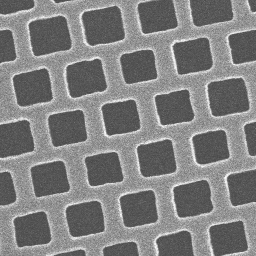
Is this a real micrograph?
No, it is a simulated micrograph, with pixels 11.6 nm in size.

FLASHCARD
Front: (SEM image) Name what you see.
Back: a regular array of holes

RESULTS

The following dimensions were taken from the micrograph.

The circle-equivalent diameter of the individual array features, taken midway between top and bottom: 444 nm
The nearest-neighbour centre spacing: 53.2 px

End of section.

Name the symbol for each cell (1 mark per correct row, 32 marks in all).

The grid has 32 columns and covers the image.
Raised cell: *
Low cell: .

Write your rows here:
....*************.....**.....**.
..*********....**.....**.....***
****....**.....***....**.....***
****.....*.....***....**********
..**.....**.....*************...
..**.....**..*********....***...
..**...**********..***....***...
..*************....***.....**...
********.....**....***....******
**....**.....**.....************
**....**.....*************.....*
**....***...**********..**.....*
**....**********.**.....**.....*
*************....***....**.....*
******.....**....***....***.****
....**.....**.....**..*********.
....**.....**...**********..***.
....**.....*********.***....***.
....*************.....**.....**.
.**********....**.....**.....***
******..***....**.....***.******
****....***....***....********..
..**.....**....*************....
..**.....*************....***...
..***.*********....***....***...
.*********...**....***.....**..*
********.....**.....**....******
**....**.....**.....************
**....***....*************.....*
**....***.***********...**.....*
**....*********..***....**.....*
********...**....***....***...**